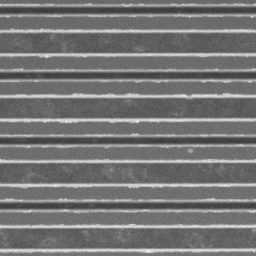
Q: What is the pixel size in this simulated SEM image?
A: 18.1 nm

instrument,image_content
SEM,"parallel lines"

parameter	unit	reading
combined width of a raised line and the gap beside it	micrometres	0.589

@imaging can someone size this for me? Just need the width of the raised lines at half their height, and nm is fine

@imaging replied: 298